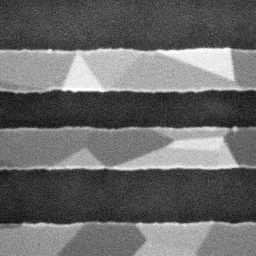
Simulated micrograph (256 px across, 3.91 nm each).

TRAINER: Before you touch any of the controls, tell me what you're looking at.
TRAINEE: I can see lines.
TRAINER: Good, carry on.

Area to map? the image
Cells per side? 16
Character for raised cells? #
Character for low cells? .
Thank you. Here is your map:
................
................
................
################
################
################
................
................
################
################
####.####.#.##..
................
................
................
################
################